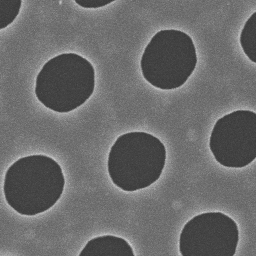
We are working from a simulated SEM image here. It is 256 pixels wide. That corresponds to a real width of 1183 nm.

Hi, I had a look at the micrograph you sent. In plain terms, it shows holes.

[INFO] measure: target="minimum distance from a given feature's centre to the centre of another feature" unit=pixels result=106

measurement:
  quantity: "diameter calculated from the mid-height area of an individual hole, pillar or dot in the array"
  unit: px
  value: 59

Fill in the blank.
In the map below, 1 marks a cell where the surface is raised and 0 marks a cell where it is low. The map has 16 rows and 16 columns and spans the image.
0111111111111111
0111111111111110
1111111110001110
1111011110001110
1100001110001111
1100001111011111
1110011111111111
1111111111111100
1111111100111000
1111111000111000
1000111000111111
0000111001111111
0000111111111111
1111111111110011
1111111111100001
1111100011100001